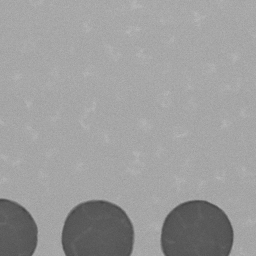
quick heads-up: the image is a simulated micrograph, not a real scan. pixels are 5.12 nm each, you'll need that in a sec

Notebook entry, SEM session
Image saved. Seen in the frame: holes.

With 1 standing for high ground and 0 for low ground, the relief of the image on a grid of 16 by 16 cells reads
1111111111111111
1111111111111111
1111111111111111
1111111111111111
1111111111111111
1111111111111111
1111111111111111
1111111111111111
1111111111111111
1111111111111111
1111111111111111
1111111111111111
1111111111111111
0011000011000011
0011000011000001
0011000011000011